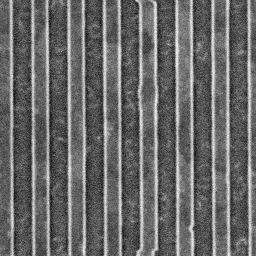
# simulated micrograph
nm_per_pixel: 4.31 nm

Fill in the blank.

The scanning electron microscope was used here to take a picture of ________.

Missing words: parallel lines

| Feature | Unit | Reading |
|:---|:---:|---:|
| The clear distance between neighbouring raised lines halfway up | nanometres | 87.8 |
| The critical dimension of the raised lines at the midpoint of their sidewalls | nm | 67.9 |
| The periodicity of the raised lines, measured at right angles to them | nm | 155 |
